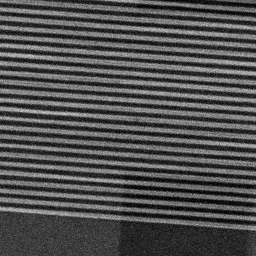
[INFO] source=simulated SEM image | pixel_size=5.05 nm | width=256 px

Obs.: parallel lines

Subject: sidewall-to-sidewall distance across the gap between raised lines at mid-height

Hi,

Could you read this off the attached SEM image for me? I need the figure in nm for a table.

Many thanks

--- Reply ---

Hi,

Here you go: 28.9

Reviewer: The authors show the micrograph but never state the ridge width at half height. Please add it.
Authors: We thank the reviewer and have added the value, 18.9 nanometers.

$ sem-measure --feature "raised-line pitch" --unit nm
45.6